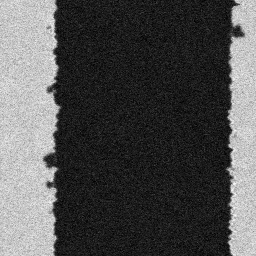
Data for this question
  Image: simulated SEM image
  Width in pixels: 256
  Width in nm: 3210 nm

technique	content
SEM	one or a few lines or trenches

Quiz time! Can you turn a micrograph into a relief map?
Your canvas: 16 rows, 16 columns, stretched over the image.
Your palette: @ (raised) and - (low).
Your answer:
---@@@@@@@@@@@@-
---@@@@@@@@@@@@-
---@@@@@@@@@@@@-
---@@@@@@@@@@@--
---@@@@@@@@@@@@-
---@@@@@@@@@@@@-
---@@@@@@@@@@@@-
---@@@@@@@@@@@--
---@@@@@@@@@@@@-
---@@@@@@@@@@@@-
---@@@@@@@@@@@--
---@@@@@@@@@@@@-
---@@@@@@@@@@@@-
---@@@@@@@@@@@@-
---@@@@@@@@@@@@-
---@@@@@@@@@@@--